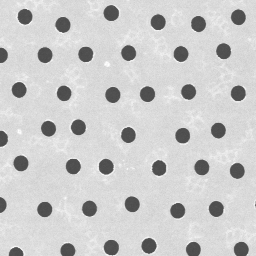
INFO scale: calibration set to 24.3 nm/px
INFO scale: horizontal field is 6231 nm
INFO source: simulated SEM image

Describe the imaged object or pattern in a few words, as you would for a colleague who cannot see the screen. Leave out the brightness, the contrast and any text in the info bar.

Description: a regular array of holes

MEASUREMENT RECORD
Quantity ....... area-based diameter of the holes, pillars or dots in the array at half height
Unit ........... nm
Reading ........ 377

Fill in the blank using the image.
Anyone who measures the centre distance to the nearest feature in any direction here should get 906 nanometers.